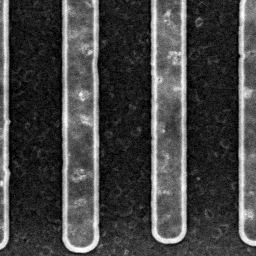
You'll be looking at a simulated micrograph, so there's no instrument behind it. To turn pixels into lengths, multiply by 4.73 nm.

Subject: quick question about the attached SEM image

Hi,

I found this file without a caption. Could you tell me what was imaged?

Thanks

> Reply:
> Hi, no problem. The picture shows one or a few lines or trenches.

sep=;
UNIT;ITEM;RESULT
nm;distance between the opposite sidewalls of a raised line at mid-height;148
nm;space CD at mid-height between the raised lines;272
